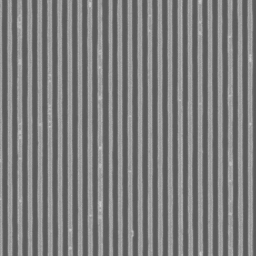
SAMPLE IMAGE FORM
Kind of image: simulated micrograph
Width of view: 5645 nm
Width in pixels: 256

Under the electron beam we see parallel lines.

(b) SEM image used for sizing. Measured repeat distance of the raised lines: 0.221 um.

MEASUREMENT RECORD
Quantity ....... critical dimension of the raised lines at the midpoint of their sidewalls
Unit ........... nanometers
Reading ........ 99.2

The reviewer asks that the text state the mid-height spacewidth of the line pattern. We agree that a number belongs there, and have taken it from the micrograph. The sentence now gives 116 nm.